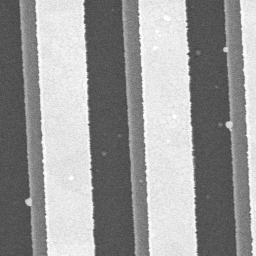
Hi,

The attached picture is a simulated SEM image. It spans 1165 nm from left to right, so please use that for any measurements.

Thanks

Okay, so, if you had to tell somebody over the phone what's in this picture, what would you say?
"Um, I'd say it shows lines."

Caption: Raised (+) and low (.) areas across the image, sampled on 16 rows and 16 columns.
.++++...++++..++
.++++...++++..++
.++++...++++..++
.++++...++++..++
.++++...++++..++
..+++...++++..++
..+++...++++..++
..+++...++++..++
..++++..++++..++
..++++..++++...+
..++++..++++...+
..++++..++++...+
..++++..++++...+
..++++..++++...+
..++++..++++...+
..++++..++++...+